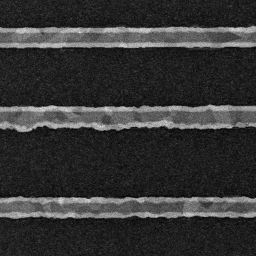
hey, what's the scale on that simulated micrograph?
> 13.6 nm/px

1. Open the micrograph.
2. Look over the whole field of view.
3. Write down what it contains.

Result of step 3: one or a few lines or trenches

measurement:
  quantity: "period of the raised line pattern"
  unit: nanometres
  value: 1160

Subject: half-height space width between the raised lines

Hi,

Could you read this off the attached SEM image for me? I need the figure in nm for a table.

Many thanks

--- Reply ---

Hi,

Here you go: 912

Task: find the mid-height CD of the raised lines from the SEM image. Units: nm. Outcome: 220